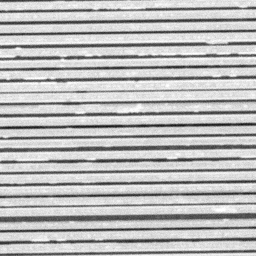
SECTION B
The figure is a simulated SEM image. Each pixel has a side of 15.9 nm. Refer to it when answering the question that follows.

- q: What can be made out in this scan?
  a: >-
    parallel lines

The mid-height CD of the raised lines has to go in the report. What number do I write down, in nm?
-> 123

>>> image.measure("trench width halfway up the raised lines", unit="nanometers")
61.6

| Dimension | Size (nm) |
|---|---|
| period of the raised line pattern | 184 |